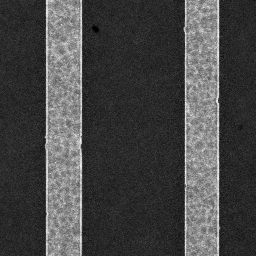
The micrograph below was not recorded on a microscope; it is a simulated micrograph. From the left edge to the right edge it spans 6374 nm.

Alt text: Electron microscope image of one or a few lines or trenches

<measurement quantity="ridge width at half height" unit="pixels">33.9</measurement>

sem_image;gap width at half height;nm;2600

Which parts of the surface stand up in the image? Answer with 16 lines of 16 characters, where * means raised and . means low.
...**.......**..
...**.......**..
...**.......**..
...**.......**..
...**.......**..
...**.......**..
...**.......**..
...**.......**..
...**.......**..
...**.......**..
...**.......**..
...**.......**..
...**.......**..
...**.......**..
...**.......**..
...**.......**..